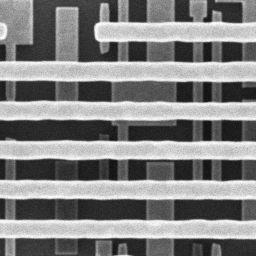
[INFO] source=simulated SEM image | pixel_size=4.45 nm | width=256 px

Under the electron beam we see wiring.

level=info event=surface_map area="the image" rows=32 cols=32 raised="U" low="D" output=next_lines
DDDDDDDDDDDDDDDDDDDDDDDDDDDDDDDD
DDDDDDDDDDDDDDDDDDDDDDDDDDDDDDDD
DDDDDDDDDDDDDDDDDDDDDDDDDDDDDDDD
UDDDDDDDDDDDUUUUUUUUUUUUUUUUUUUU
UDDDDDDDDDDDUUUUUUUUUUUUUUUUUUUU
DDDDDDDDDDDDDDDDDDDDDDDDDDDDDDDD
DDDDDDDDDDDDDDDDDDDDDDDDDDDDDDDD
DDDDDDDDDDDDDDDDDDDDDDDDDDDDDDDD
UUUUUUUUUUUUUUUUUUUUUUUUUUUUUUUU
UUUUUUUUUUUUUUUUUUUUUUUUUUUUUUUU
DDDDDDDDDDDDDDDDDDDDDDDDDDDDDDDD
DDDDDDDDDDDDDDDDDDDDDDDDDDDDDDDD
DDDDDDDDDDDDDDDDDDDDDDDDDDDDDDDD
UUUUUUUUUUUUUUUUUUUUUUUUUUUUUUUU
UUUUUUUUUUUUUUUUUUUUUUUUUUUUUUUU
DDDDDDDDDDDDDDDDDDDDDDDDDDDDDDDD
DDDDDDDDDDDDDDDDDDDDDDDDDDDDDDDD
DDDDDDDDDDDDDDDDDDDDDDDDDDDDDDDD
UUUUUUUUUUUUUUUUUUUUUUUUUUUUUUUU
UUUUUUUUUUUUUUUUUUUUUUUUUUUUUUUU
DDDDDDDDDDDDDDDDDDDDDDDDDDDDDDDD
DDDDDDDDDDDDDDDDDDDDDDDDDDDDDDDD
DDDDDDDDDDDDDDDDDDDDDDDDDDDDDDDD
UUUUUUUUUUUUUUUUUUUUUUUUUUUUUUUU
UUUUUUUUUUUUUUUUUUUUUUUUUUUUUUUU
DDDDDDDDDDDDDDDDDDDDDDDDDDDDDDDD
DDDDDDDDDDDDDDDDDDDDDDDDDDDDDDDD
UUDDDDUUDDUUDDDUUUDDDDDUUUDUUDDD
UUUUUUUUUUUUUUUUUUUUUUUUUUUUUUUU
UUUUUUUUUUUUUUUUUUUUUUUUUUUUUUUU
DDDDDDDDDDDDDDDDDDDDDDDDDDDDDDDD
DDDDDDDDDDDDDDDDDDDDDDDDDDDDDDDD